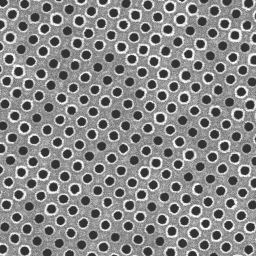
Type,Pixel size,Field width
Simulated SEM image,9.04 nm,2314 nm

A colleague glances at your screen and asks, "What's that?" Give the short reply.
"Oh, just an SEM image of a regular array of holes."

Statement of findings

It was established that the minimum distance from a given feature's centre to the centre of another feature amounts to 138 nanometers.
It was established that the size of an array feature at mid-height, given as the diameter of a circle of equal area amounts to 82.9 nm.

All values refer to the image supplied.